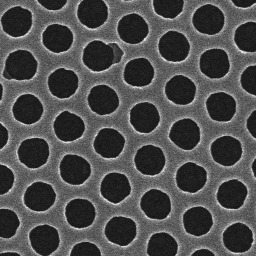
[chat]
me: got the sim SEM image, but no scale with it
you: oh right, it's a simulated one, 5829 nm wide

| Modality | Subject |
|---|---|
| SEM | a regular array of holes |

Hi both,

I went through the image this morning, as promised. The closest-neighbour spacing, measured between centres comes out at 997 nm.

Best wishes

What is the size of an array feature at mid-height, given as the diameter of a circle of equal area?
698 nanometers